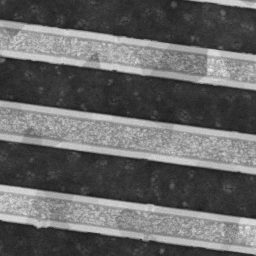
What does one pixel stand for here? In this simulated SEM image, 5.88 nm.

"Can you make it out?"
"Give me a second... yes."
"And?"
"one or a few lines or trenches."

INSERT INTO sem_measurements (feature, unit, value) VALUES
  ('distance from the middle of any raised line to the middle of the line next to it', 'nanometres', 479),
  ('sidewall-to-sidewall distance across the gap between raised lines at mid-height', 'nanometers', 300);